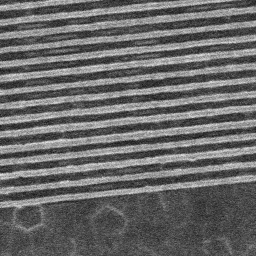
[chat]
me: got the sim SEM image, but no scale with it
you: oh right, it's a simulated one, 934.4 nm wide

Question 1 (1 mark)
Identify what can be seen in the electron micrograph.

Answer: parallel lines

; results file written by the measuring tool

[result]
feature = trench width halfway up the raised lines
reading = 31.8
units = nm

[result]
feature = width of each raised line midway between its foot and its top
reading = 21.3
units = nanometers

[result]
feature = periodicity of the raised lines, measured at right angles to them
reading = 51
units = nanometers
